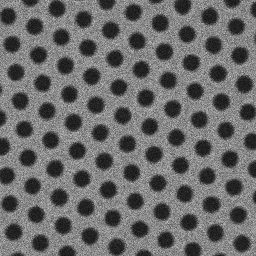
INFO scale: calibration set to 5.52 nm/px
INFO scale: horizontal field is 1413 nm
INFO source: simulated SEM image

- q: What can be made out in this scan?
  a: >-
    a regular array of holes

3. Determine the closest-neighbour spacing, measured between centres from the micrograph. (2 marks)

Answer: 157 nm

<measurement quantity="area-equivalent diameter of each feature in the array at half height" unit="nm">95.5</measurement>